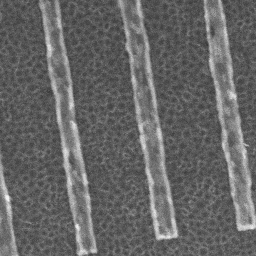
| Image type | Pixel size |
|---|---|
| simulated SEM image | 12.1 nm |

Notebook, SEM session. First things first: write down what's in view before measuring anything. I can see one or a few lines or trenches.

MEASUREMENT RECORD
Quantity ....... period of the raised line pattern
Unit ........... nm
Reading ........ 973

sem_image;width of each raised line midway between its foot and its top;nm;203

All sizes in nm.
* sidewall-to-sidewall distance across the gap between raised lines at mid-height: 772